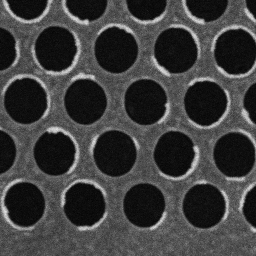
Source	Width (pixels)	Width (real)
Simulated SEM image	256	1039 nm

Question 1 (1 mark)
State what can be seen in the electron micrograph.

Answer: a regular array of holes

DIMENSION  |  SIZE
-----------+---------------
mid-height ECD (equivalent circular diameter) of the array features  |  180 nm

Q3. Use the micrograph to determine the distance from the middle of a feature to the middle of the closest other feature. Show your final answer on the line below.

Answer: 241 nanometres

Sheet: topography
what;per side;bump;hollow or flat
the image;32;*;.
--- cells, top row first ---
*.....**.....***.....**.....***.
**...****....***....****....***.
***.*******.******.******..*****
******..******.*****************
..***....***.....***....***....*
..**.....***.....**......**.....
..**......**.....**......**.....
..***....***.....***.....**.....
.****...*****...****....****...*
********************************
*....****...****....****...*****
*.....**.....***.....**.....***.
......**.....***.....**.....**..
*.....**.....***.....**.....***.
*....****....***....***.....***.
***.******.******..******..*****
.************..******..*********
..***....***.....***....***....*
..**.....***.....**.....***.....
..**.....***.....**.....***.....
..***....***.....***....***.....
.****...*****...****...*****...*
********************************
*....****...****....****...*****
*....***.....***....***.....***.
*.....**.....**......**.....**..
*....***.....**.....***.....**..
*....****...****....***.....***.
*************************.******
********************************
********************************
********************************